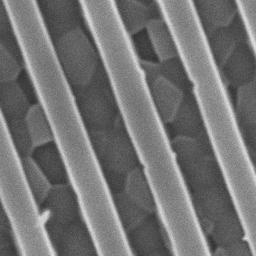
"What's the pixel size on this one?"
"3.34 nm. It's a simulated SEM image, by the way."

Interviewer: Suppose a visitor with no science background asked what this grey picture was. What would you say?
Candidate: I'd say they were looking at one or a few lines or trenches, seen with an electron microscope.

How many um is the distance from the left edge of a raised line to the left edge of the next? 0.242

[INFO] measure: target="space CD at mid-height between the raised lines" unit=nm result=141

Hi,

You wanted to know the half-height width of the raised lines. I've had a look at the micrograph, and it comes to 99.6 nm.